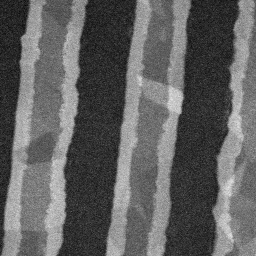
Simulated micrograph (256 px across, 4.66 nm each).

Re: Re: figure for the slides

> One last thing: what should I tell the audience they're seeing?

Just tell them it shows one or a few lines or trenches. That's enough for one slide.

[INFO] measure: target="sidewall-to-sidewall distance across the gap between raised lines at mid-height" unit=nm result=295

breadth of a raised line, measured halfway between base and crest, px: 41.3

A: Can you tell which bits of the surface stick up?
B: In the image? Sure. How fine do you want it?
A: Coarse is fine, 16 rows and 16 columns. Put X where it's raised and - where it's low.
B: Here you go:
--XXX----XX----X
--XXX----XX----X
--XXX----XX----X
--XX-----XX----X
--XX----XXX----X
--XX----XXX----X
--XX----XXX----X
-XXX----XXX----X
-XXX----XXX----X
-XXX----XX----XX
-XXX----XX----XX
-XXX----XX----XX
-XXX----XX----XX
-XX----XXX----XX
-XX----XXX----XX
-XX----XXX----XX